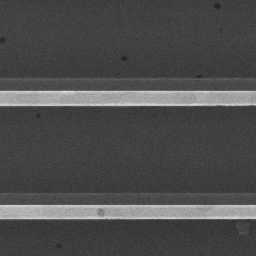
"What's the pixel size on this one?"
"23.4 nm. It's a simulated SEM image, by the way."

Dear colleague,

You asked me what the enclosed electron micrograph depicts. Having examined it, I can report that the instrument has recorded lines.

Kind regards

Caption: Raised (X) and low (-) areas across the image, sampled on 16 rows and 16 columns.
----------------
----------------
----------------
----------------
----------------
XXXXXXXXXXXXXXXX
XXXXXXXXXXXXXXXX
----------------
----------------
----------------
----------------
----------------
XXXXXXXXXXXXXXXX
XXXXXXXXXXXXXXXX
----------------
----------------